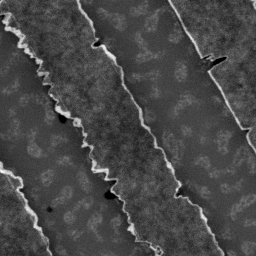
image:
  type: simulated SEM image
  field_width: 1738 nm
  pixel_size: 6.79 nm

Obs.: one or a few lines or trenches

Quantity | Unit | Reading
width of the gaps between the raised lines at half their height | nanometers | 546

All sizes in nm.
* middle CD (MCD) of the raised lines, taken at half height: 442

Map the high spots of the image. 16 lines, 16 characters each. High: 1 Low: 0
1111100000011111
1111110000011111
0111110000001111
0011111000000111
0001111100000111
0001111100000011
0001111110000011
0000011110000001
0000011111000001
0000001111000000
0000001111100000
1000000111100000
1100000011110000
1100000011111000
1110000011111000
1110000000111100